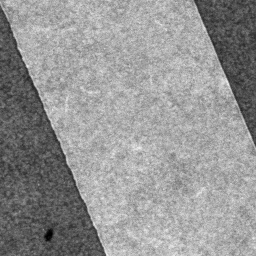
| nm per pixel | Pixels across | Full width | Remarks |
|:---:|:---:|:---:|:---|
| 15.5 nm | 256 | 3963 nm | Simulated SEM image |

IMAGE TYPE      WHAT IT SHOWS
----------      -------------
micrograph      one or a few lines or trenches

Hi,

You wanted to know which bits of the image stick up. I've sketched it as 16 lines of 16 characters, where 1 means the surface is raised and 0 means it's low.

1111111111110000
0111111111111000
0111111111111000
0111111111111100
0011111111111100
0011111111111100
0001111111111110
0001111111111110
0000111111111111
0000111111111111
0000111111111111
0000011111111111
0000011111111111
0000001111111111
0000001111111111
0000000111111111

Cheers